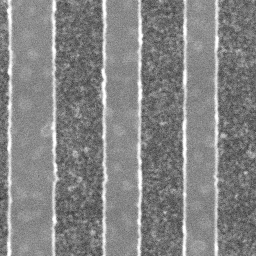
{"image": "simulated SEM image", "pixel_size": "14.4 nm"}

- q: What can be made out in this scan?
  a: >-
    one or a few lines or trenches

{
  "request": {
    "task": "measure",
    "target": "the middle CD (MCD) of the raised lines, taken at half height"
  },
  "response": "688 nanometres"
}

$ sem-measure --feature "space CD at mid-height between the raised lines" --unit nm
506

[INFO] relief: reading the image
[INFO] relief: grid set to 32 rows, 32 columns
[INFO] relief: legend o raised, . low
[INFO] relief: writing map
o......oooooo....oooooo....ooooo
o......oooooo....oooooo....ooooo
o......oooooo....oooooo....ooooo
o......oooooo....oooooo....ooooo
o......oooooo....oooooo....ooooo
o......oooooo.....ooooo....ooooo
o......oooooo....oooooo....ooooo
o......oooooo....oooooo....ooooo
o......oooooo....oooooo....ooooo
o......oooooo....oooooo....ooooo
o......oooooo....oooooo....ooooo
o......oooooo....oooooo....ooooo
o......oooooo....oooooo....ooooo
o......oooooo.....ooooo....ooooo
o......oooooo....oooooo....ooooo
o......oooooo.....ooooo....ooooo
o......oooooo....oooooo....ooooo
o......oooooo....oooooo....ooooo
o......oooooo....oooooo....ooooo
o......oooooo....oooooo....ooooo
o......oooooo.....ooooo....ooooo
o......oooooo....oooooo....ooooo
o......oooooo....oooooo....ooooo
o......oooooo....oooooo....ooooo
o......oooooo.....ooooo....ooooo
o......oooooo....oooooo....ooooo
o......oooooo.....ooooo....ooooo
o......oooooo....oooooo....ooooo
o......oooooo....oooooo....ooooo
o......oooooo....oooooo....ooooo
o......oooooo....oooooo....ooooo
o......oooooo....oooooo....ooooo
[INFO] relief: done